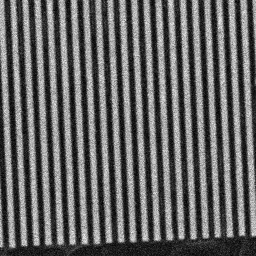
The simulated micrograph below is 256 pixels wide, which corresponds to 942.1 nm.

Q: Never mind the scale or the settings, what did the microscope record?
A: parallel lines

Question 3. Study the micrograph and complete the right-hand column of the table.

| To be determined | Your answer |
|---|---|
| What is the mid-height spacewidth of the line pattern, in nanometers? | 22.5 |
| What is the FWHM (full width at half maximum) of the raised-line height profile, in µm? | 0.0225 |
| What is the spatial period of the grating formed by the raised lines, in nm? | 44.5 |